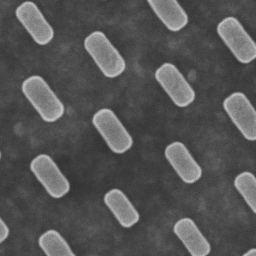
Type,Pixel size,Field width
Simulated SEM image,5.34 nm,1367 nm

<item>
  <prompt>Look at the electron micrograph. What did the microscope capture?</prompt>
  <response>a regular array of raised bodies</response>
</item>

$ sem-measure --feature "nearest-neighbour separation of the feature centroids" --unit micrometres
0.408